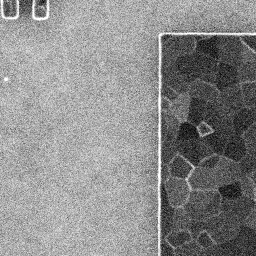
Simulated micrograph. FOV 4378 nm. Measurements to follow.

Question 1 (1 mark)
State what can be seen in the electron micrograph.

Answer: wiring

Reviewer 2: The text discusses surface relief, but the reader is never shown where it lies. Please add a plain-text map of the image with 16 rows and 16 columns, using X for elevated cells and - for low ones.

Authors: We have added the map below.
X-X-------------
----------------
----------XXXXXX
----------XXXXXX
----------XXXXXX
----------XXXXXX
----------XXXXXX
----------XXXXXX
----------XXXXXX
----------XXXXXX
----------XXXXXX
----------XXXXXX
----------XXXXXX
----------XXXXXX
----------XXXXXX
----------XXXXXX